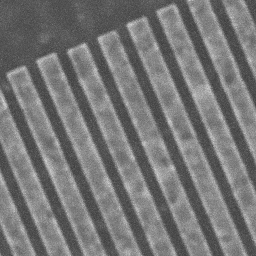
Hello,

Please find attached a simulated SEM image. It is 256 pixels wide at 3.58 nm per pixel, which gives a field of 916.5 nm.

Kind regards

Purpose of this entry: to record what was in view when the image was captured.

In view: parallel lines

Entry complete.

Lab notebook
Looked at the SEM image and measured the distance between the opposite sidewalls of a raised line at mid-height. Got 68.7 nm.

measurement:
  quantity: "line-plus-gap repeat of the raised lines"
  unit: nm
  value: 115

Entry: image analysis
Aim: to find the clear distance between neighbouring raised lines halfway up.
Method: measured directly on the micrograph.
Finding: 47.8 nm